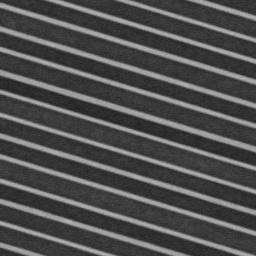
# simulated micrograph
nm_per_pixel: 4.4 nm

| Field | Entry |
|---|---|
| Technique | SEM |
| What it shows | parallel lines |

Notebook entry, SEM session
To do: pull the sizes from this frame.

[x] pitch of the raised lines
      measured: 20.8 pixels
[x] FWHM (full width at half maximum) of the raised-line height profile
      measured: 20.5 nm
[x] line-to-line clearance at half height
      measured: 70.1 nm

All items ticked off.